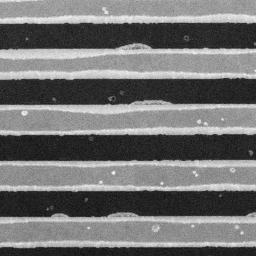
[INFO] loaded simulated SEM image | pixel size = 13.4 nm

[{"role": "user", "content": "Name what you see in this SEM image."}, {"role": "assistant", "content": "lines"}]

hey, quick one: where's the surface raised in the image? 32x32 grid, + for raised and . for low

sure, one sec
++++++++++++++++++++++++++++++++
++++++++++++++++++++++++++++++++
++++++++++.+++++++++++++++.....+
................................
................................
................................
.............+++++++++++++++++++
++++++++++++++++++++++++++++++++
++++++++++++++++++++++++++++++++
+++.....++.......+.+....++++++++
................................
................................
................................
+++++++++.......++++++++++++++++
++++++++++++++++++++++++++++++++
++++++++++++++++++++++++++++++++
+++++++++++++++++++.............
................................
................................
................................
++++++++++++++++++++++++++++++++
++++++++++++++++++++++++++++++++
++++++++++++++++++++++++++++++++
++++++++++++++++++++++++++......
................................
................................
................................
++++++++++++++++++++++++++++++++
++++++++++++++++++++++++++++++++
++++++++++++++++++++++++++++++++
++++++++++++++++++++++++++++++++
................................